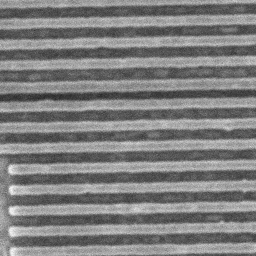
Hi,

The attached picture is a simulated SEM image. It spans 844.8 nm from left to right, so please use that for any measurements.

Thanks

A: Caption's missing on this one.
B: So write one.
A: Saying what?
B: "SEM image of parallel lines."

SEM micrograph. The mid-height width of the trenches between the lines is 38.7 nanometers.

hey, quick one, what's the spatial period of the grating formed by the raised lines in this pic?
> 68.5 nm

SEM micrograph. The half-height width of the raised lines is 28.8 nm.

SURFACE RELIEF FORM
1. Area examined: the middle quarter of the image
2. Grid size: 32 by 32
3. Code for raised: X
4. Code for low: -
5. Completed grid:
XXXXXXXXXXXXXXXXX--XXXXXXXXXXX--
--------------------------------
--------------------------------
--------------------------------
X---XXXX--XXXXXXXXXXXXXXXXXXXXXX
XXXXXXXXXXXXXXXXXXXXXXXXXXXXXXXX
XXXXXXXXXXXXXXXXXXXXX-----------
--------------------------------
--------------------------------
XX---XXXXXXXXXXXXXXXXXXXXXXXXXXX
XXXXXXXXXXXXXXXXXXXXXXXXXXXXXXXX
XXX-----------------------------
--------------------------------
--------------------------------
------------XXXXXXXXXXXXXXXXXXXX
XXXXXXXXXXXXXXXXXXXXXXXXXXXXXXXX
XXXXXXXXXX----------------------
--------------------------------
--------------------------------
--------------------XXX-XXXXXXXX
XXXXXXXXXXXXXXXXXXXXXXXXXXXXXXXX
XXXXXXXXXXXXXXXXX----XXXX-------
--------------------------------
--------------------------------
------------------------------X-
XXXXXXXXXXXXXXXXXXXXXXXXXXXXXXXX
XXXXXXXXXXXXXXXXXXXXXXXXXXXXXXX-
--------------------------------
--------------------------------
--------------------------------
XXXXXXXXXXXXXXXXXXXXXXXXXXXXXXXX
XXXXXXXXXXXXXXXXXXXXXXXXXXXXXXXX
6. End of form